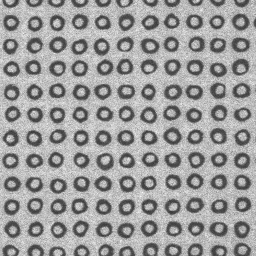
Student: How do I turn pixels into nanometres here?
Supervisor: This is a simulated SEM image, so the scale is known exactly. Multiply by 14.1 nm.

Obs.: a regular array of ring-shaped grooves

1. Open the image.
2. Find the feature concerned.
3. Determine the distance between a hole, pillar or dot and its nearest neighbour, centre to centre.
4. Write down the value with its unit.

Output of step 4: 307 nm